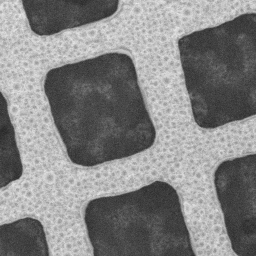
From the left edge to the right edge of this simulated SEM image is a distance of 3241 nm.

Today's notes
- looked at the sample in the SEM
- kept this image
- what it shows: holes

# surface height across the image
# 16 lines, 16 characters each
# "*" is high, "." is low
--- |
*......*********
**....********..
***********.....
******..***.....
***......**.....
***......***....
***......***....
.**......***...*
.***......******
.***.....*******
.*************..
.********.***...
******.....***..
*****......***..
...**.......**..
...***......***.